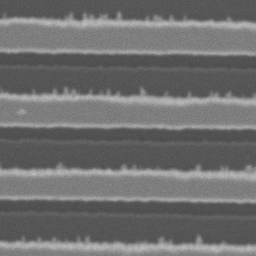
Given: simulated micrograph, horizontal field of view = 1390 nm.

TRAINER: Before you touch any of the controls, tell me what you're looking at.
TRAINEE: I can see lines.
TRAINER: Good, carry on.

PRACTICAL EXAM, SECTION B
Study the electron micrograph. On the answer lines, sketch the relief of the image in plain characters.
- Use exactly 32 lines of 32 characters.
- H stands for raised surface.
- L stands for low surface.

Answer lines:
LLLLLLLLLLLLLLLLLLLLLLLLLLLLLLLL
LLLLLLLLLLLLLLLLLLLLLLLLLLLLLLLL
HHHHHHHHLLHHHLLLLLLLLLLLLLLLLLLL
HHHHHHHHHHHHHHHHHHHHHHHHHHHHHHHH
HHHHHHHHHHHHHHHHHHHHHHHHHHHHHHHH
HHHHHHHHHHHHHHHHHHHHHHHHHHHHHHHH
HHHLHHHHHHHHHHHHHHHHHHHHHHHHHHHH
LLLLLLLLLLLLLLLLLLLLLLLLLLLLLLLL
LLLLLLLLLLLLLLLLLLLLLLLLLLLLLLLL
LLLLLLLLLLLLLLLLLLLLLLLLLLLLLLLL
LLLLLLLLLLLLLLLLLLLLLLLLLLLLLLLL
LLLLLLLLLLLLLLLLLLLLLLLLLLLLLLLL
HHHHHHHHHHHHHHHHHHHHHHHHHHHHHHHH
HHHHHHHHHHHHHHHHHHHHHHHHHHHHHHHH
HHHHHHHHHHHHHHHHHHHHHHHHHHHHHHHH
HHHHHHHHHHHHHHHHHHHHHHHHHHHHHHHH
LLLLLLLLLLLLLLLLLLLLLLLLLLLLLLLL
LLLLLLLLLLLLLLLLLLLLLLLLLLLLLLLL
LLLLLLLLLLLLLLLLLLLLLLLLLLLLLLLL
LLLLLLLLLLLLLLLLLLLLLLLLLLLLLLLL
LLLLLLLLLLLLLLLLLLLLLLLLLLLLLLLL
HHHHHHHHHHHHHHHHHHHHHHHHHHHHHHHL
HHHHHHHHHHHHHHHHHHHHHHHHHHHHHHHH
HHHHHHHHHHHHHHHHHHHHHHHHHHHHHHHH
HHHHHHHHHHHHHHHHHHHHHHHHHHHHHHHH
LLLLLLLLLLLLLLLLLLLLLLLLLLLLLLLL
LLLLLLLLLLLLLLLLLLLLLLLLLLLLLLLL
LLLLLLLLLLLLLLLLLLLLLLLLLLLLLLLL
LLLLLLLLLLLLLLLLLLLLLLLLLLLLLLLL
LLLLLLLLLLLLLLLLLLLLLLLLLLLLLLLL
HHHHHHHHHHHHHHHLLLLLHLLHLLLLLLLL
HHHHHHHHHHHHHHHHHHHHHHHHHHHHHHHH